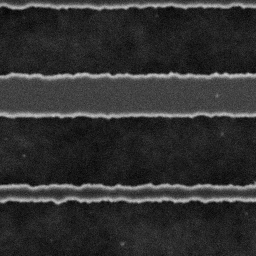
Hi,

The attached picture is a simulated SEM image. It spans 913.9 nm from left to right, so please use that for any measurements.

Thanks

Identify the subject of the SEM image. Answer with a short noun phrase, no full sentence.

lines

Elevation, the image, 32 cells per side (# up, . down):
################################
................................
................................
................................
................................
................................
................................
................................
................................
######.#########################
################################
################################
################################
################################
#########################.#.####
................................
................................
................................
................................
................................
................................
................................
................................
################################
################################
................................
................................
................................
................................
................................
................................
................................